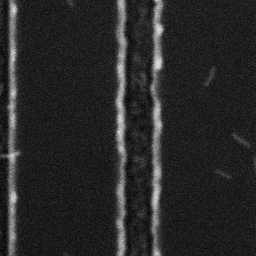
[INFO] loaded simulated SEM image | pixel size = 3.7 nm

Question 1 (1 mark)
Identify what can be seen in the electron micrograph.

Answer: one or a few lines or trenches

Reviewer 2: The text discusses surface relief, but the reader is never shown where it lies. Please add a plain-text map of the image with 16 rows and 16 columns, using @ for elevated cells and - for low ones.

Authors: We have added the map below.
-@@@@@@@--@@@@@@
-@@@@@@@--@@@@@@
-@@@@@@@--@@@@@@
-@@@@@@@--@@@@@@
-@@@@@@@--@@@@@@
-@@@@@@@--@@@@@@
-@@@@@@@--@@@@@@
-@@@@@@@--@@@@@@
-@@@@@@@--@@@@@@
-@@@@@@@--@@@@@@
-@@@@@@@--@@@@@@
-@@@@@@@--@@@@@@
-@@@@@@@--@@@@@@
-@@@@@@@--@@@@@@
-@@@@@@@--@@@@@@
-@@@@@@@--@@@@@@